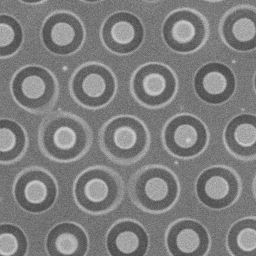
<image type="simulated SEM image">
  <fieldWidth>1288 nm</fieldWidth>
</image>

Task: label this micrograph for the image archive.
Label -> an array of small figures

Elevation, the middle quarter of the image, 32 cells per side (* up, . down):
*****.....**********.....*******
****.......*******.........*****
***.........******.........*****
**...****....****....***....****
**...*****...****...*****...****
**...*****...****...*****...****
**...*****...****....****...****
**....***....****...........****
***.........******.........*****
****.......********.......******
*****.....***********...********
********************************
******************************.*
...**********.....*********.....
....*******........*******......
.....*****..........*****....**.
*.....****....**.....****...****
**....***....****....****...****
**....***....*****...****...****
**....****...****....****...****
*.....****....***....****....***
.....*****..........******......
.....******........********.....
...*********......************.*
***************.****************
**********************.*********
******.....*********......******
****........*******........*****
****.........*****..........****
***....***....***....****...****
***...*****...***...******...***
**....*****...***...******...***